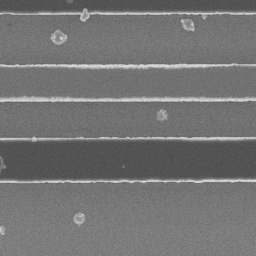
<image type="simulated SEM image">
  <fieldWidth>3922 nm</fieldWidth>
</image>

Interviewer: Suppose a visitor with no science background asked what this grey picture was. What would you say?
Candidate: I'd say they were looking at lines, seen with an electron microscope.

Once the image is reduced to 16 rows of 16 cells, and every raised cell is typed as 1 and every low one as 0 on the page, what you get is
1111111111111111
0000000000000000
0000000000000000
0000000000000000
0000000000000000
0000000000000000
0000000000000000
0000000000000000
0000000000000000
1111111111111111
1111111111111111
0000000000000000
0000000000000000
0000000000000000
0000000000000000
0000000000000000